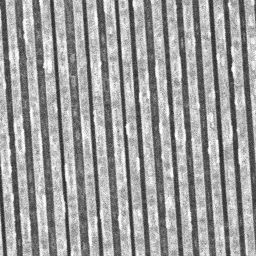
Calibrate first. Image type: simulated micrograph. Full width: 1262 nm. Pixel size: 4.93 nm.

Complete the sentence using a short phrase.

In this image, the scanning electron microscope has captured parallel lines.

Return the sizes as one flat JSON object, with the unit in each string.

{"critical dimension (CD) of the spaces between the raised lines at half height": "0.0344 µm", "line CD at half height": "44.3 nm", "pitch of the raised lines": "0.0783 um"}